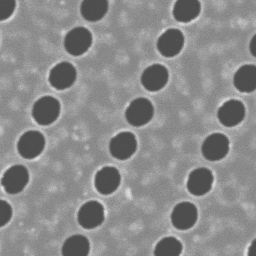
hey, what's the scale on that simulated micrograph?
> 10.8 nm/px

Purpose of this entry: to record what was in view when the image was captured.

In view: a regular array of holes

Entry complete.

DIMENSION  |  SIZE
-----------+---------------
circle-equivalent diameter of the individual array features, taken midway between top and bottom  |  0.311 microns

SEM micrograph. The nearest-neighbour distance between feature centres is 0.405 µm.